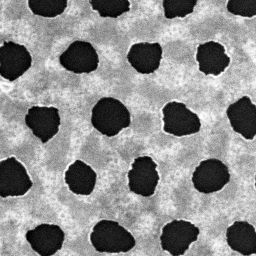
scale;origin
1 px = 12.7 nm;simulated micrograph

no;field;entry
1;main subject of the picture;a regular array of holes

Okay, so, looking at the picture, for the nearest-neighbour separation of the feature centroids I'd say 0.828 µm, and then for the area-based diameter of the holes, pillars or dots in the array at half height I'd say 460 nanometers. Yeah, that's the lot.